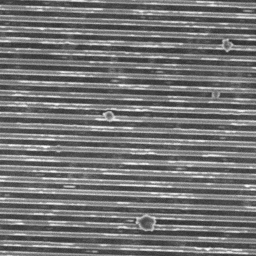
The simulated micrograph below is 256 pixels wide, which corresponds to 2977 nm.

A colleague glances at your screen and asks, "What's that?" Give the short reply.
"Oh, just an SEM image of parallel lines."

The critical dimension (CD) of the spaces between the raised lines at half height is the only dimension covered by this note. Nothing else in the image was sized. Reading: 5.49 px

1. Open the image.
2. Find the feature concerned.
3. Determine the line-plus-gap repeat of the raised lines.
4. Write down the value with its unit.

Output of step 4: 125 nanometers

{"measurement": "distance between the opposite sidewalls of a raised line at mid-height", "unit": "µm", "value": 0.0552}